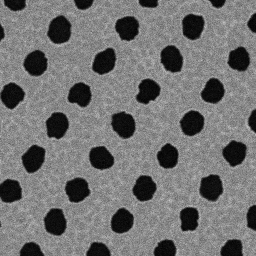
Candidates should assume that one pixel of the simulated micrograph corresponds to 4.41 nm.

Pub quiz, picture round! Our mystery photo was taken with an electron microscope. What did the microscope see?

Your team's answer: a regular array of holes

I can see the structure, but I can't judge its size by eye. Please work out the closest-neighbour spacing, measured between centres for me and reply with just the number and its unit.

176 nm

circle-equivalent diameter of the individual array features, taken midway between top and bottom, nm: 106